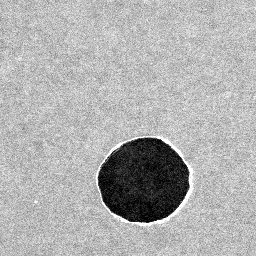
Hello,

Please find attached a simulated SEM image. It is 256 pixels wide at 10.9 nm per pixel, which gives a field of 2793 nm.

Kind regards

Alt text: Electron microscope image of holes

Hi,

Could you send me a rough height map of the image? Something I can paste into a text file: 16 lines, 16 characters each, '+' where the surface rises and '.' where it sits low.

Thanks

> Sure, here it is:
++++++++++++++++
++++++++++++++++
++++++++++++++++
++++++++++++++++
++++++++++++++++
++++++++++++++++
++++++++++++++++
++++++++++++++++
++++++++++++++++
+++++++....+++++
++++++......++++
++++++......++++
++++++......++++
+++++++....+++++
++++++++++++++++
++++++++++++++++